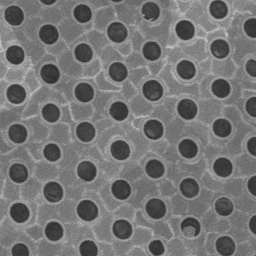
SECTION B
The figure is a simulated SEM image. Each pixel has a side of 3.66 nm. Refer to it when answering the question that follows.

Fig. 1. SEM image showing a regular array of holes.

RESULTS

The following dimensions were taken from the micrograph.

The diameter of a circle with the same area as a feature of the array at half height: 0.0778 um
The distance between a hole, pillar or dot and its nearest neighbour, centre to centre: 143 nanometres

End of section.